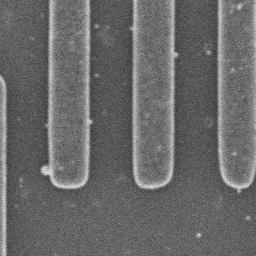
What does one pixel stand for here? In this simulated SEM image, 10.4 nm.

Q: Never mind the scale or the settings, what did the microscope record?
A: wiring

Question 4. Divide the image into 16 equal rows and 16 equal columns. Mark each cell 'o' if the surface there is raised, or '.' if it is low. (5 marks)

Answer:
...ooo..ooo...oo
...ooo..ooo...oo
...ooo..ooo...oo
...ooo..ooo...oo
...ooo..ooo...oo
...ooo..ooo...oo
...ooo..ooo...oo
...ooo..ooo...oo
...ooo..ooo...oo
...ooo..ooo...oo
...ooo..ooo...oo
...oo....o....oo
................
................
................
................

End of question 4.